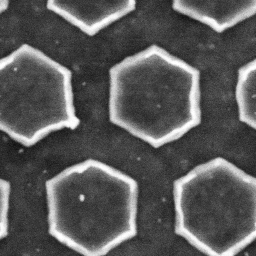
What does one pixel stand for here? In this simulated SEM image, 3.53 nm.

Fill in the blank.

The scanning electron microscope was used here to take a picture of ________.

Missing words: raised bodies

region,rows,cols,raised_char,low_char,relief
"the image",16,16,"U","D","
DDDUUUUUDDDUUUUU
DDDDDUUDDDDDDUDD
DDDDDDDDDDDDDDDD
DUUDDDDDDUDDDDDD
UUUUDDDUUUUUDDDU
UUUUDDDUUUUUDDDU
UUUUDDDUUUUUDDDU
UUUUUDDUUUUUDDDU
DUUDDDDDDUUDDDDD
DDDDDDDDDDDDDDDD
DDDDDUUDDDDDDUUD
DDDUUUUUDDDUUUUU
DDDUUUUUDDDUUUUU
DDDUUUUUDDDUUUUU
DDDUUUUUDDDUUUUU
DDDDDUUDDDDDDUUD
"